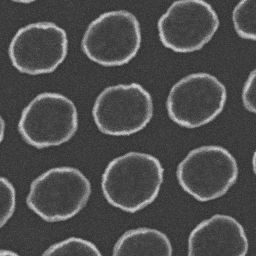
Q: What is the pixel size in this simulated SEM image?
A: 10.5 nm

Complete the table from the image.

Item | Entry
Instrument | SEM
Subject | a regular array of raised bodies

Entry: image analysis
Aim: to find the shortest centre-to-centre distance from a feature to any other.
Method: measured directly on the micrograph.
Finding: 766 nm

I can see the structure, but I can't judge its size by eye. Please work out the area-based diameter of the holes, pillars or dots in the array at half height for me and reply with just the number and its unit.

0.568 µm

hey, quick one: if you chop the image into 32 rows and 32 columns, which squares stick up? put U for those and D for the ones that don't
DDDDDDDDDDDDDDDDDDDDDDUUUUDDDDUU
DDDDDDDDDDDDDDDDDDDDDUUUUUUDDUUU
DDDDDDDDDDDDUUUUUDDDUUUUUUUDDUUU
DDDUUUUDDDDUUUUUUDDDUUUUUUUDDDUU
DDUUUUUUDDDUUUUUUDDDUUUUUUDDDDDU
DUUUUUUUDDDUUUUUUDDDUUUUUDDDDDDD
DUUUUUUUDDDUUUUUUDDDDDDDDDDDDDDD
DDUUUUUUDDDDUUUUDDDDDDDDDDDDDDDD
DDUUUUUDDDDDDDDDDDDDDDDDDDDDDDDD
DDDDDDDDDDDDDDDDDDDDDDDDUUDDDDDU
DDDDDDDDDDDDDDDDDDDDDDUUUUUDDDDU
DDDDDDDDDDDDDUUUUUDDDUUUUUUUDDDU
DDDDUUUUDDDDUUUUUUUDDUUUUUUUDDDU
DDDUUUUUUDDDUUUUUUUDDUUUUUUUDDDU
DDDUUUUUUDDDUUUUUUUDDUUUUUUDDDDD
DDUUUUUUUDDDUUUUUUDDDDDUUDDDDDDD
DDDUUUUUUDDDDUUUUDDDDDDDDDDDDDDD
DDDDUUUUDDDDDDDDDDDDDDDDDDDDDDDD
DDDDDDDDDDDDDDDDDDDDDDDDDDDDDDDD
DDDDDDDDDDDDDDDDUUDDDDDDUUUUUDDD
DDDDDDDDDDDDDDUUUUUUDDDUUUUUUDDD
DDDDDDUUUUDDDUUUUUUUDDUUUUUUUDDD
DDDDDUUUUUUDDUUUUUUUDDDUUUUUUDDD
UDDDUUUUUUUDDUUUUUUUDDDUUUUUDDDD
UUDDUUUUUUUDDUUUUUUDDDDDUUUDDDDD
UUDDUUUUUUDDDDUUUUDDDDDDDDDDDDDD
UDDDDUUUUUDDDDDDDDDDDDDDDDDDDDDD
UDDDDDDDDDDDDDDDDDDDDDDDDDUUUDDD
DDDDDDDDDDDDDDDDDDDDDDDDDUUUUUDD
DDDDDDDDDDDDDDDDUUUUDDDDUUUUUUUD
DDDDDDDUUUUDDDDUUUUUUDDDUUUUUUUD
UDDDDDUUUUUUDDUUUUUUUDDDUUUUUUUD